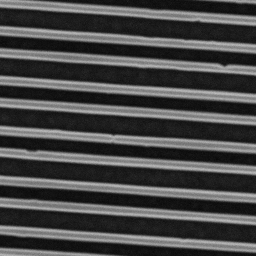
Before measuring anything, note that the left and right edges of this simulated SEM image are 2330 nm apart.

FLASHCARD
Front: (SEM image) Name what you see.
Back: parallel lines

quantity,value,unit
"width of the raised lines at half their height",0.0692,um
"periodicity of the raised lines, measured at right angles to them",229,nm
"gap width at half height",183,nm